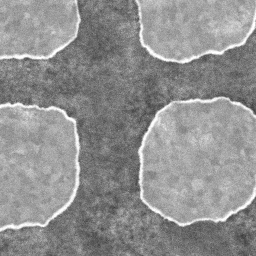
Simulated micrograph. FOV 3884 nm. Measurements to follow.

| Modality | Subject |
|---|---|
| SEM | raised bodies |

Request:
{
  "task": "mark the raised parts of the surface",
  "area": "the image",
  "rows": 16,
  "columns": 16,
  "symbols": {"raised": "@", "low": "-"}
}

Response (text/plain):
@@@@@----@@@@@@@
@@@@@----@@@@@@@
@@@@-----@@@@@@-
@@@-------@@@---
----------------
----------------
-----------@@@@-
@@@@------@@@@@@
@@@@@----@@@@@@@
@@@@@----@@@@@@@
@@@@@----@@@@@@@
@@@@@----@@@@@@@
@@@@-----@@@@@@@
@@@-------@@@@--
----------------
----------------